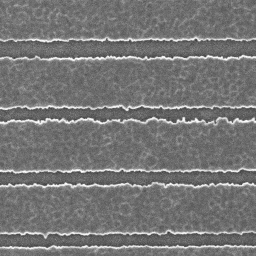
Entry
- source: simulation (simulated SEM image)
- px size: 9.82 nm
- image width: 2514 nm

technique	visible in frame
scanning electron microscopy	one or a few lines or trenches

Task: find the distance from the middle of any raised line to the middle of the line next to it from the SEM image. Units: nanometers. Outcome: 621